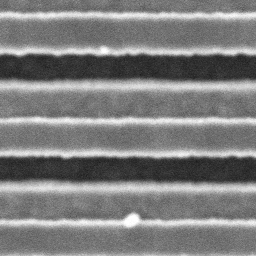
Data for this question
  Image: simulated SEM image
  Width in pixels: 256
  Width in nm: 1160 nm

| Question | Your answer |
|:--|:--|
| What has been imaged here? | lines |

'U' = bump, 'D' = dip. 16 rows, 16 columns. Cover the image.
UUUUUUUUUUUUUUUU
UUUUUUUUUUUUUUUU
UUUUUUUUUUUUUUUU
DDDDDDDDDDDDDDDD
DDDDDDDDDDDDDDDD
UUUUUUUUUUUUUUUU
UUUUUUUUUUUUUUUU
UUUUUUUUUUUUUUUU
UUUUUUUUUUUUUUUU
UUUUUUUUUUUUUUUU
DDDDDDDDDDDDDDDD
DDDDDDDDDDDDDDDD
UUUUUUUUUUUUUUUU
UUUUUUUUUUUUUUUU
UUUUUUUUUUUUUUUU
UUUUUUUUUUUUUUUU